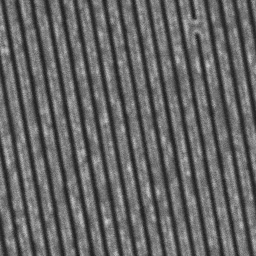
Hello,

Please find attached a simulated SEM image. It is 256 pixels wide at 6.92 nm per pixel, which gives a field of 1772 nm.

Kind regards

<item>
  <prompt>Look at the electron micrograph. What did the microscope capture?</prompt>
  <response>parallel lines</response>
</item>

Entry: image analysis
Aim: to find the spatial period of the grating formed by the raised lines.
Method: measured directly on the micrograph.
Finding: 98.6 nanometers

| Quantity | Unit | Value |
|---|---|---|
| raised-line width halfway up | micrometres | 0.0604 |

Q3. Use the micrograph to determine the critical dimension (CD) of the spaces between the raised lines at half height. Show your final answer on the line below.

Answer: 36.6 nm